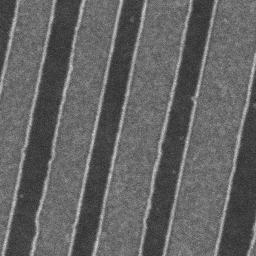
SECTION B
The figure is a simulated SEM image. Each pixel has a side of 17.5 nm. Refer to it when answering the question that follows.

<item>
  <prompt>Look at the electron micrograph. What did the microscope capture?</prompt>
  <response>one or a few lines or trenches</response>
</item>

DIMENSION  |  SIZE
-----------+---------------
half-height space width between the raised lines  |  748 nanometers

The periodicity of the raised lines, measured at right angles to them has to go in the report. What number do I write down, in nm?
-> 1160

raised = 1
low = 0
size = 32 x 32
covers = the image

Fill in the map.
11000001110000011100000011100000
11000001110000011100000011100000
11000011110000011100000111100000
11000011110000111100000111000000
10000011100000111000000111000000
10000011100000111000000111000000
10000011100000111000000111000000
10000111100000111000001111000000
10000111100001111000001110000000
00000111100001110000001110000001
00000111000001110000001110000001
00000111000001110000001110000001
00001111000001110000011100000001
00001111000011110000011100000001
00001110000011100000011100000011
00001110000011100000011100000011
00011110000011100000111100000011
00011110000011100000111100000011
00011110000111100000111000000011
00011110000111000000111000000111
00011100000111000000111000000111
00111100000111000001111000000111
00111100000111000001111000000111
00111100001110000001110000000111
00111000001110000001110000001111
00111000001110000001110000001111
01111000001110000011110000001111
01111000001110000011100000001111
01111000011110000011100000001111
01111000011100000011100000011111
01110000011100000011100000011111
11110000011100000011100000011110